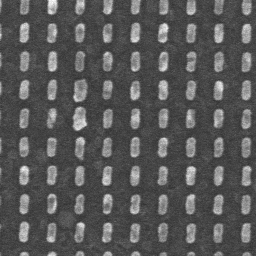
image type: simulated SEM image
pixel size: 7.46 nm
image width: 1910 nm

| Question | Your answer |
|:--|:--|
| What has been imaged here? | a regular array of raised bodies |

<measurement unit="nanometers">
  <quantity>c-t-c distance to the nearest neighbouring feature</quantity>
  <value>205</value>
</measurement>